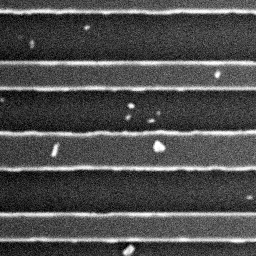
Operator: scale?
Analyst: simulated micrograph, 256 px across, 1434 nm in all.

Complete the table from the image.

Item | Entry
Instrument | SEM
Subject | lines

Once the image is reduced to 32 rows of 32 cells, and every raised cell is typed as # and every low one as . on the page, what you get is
################################
################################
................................
................................
................................
................................
................................
................................
################################
################################
################################
................................
................................
................................
................................
................................
...................##.........##
################################
################################
################################
################################
................................
................................
................................
................................
................................
................................
################################
################################
################################
................................
................................